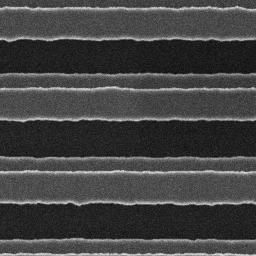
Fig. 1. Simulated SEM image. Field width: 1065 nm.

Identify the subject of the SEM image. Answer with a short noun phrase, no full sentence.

lines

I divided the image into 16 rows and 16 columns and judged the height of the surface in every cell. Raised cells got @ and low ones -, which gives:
@@@@@@@@@@@@@@@@
@@@@@@@@@@@@@@@@
@-----@--@--@-@-
----------------
----------------
@@@@@@@@@@@@@@@@
@@@@@@@@@@@@@@@@
@@-@@-@@@----@@@
----------------
----------------
@@@@@@@@@@@@@@@@
@@@@@@@@@@@@@@@@
@@@@@@@@@@@@@@@@
----------------
----------------
@@@@@@@@@@@@@@@@